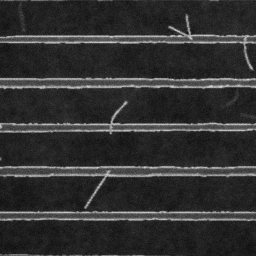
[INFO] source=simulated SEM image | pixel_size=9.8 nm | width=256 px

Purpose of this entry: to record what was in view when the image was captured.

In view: lines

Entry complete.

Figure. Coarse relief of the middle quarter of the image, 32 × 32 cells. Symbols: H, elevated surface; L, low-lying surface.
LLLLLLLLLLLLLLLLLLLLLLLLLLLLLLLL
LLLLLLLLLLLLLLLLLLLLLLLLLLLLLLLL
LLLLLLLLLLLLLLLLLLLLLLLLLLLLLLLL
LLLLLLLLLLLLLLLLLLLLLLLLLLLLLLLL
HHHHHHHHHHHHHHHHHHHHHHHHHHHHHHHH
HHHHHHHHHHHHHHHHHHHHHHHHHHHHHHHH
LLLLLLLLLLLLLLLLLLLLLLLLLLLLLLLL
LLLLLLLLLLLLLLLLLLLLLLLLLLLLLLLL
LLLLLLLLLLLLLLLLLLLLLLLLLLLLLLLL
LLLLLLLLLLLLLLLLLLLLLLLLLLLLLLLL
LLLLLLLLLLLLLLLLLLLLLLLLLLLLLLLL
LLLLLLLLLLLLLLLLLLLLLLLLLLLLLLLL
LLLLLLLLLLLLLLLLLLLLLLLLLLLLLLLL
LLLLLLLLLLLLLLLLLLLLLLLLLLLLLLLL
LLLLLLLLLLLLLLLLLLLLLLLLLLLLLLLL
HHHHHHHHHHHHHHHHHHHHHHHHHHHHHHHH
HHHHHHHHHHHHHHHHHHHHHHHHHHHHHHHH
LLLLLLLLLLLLLLLLLLLLLLLLLLLLLLLL
LLLLLLLLLLLLLLLLLLLLLLLLLLLLLLLL
LLLLLLLLLLLLLLLLLLLLLLLLLLLLLLLL
LLLLLLLLLLLLLLLLLLLLLLLLLLLLLLLL
LLLLLLLLLLLLLLLLLLLLLLLLLLLLLLLL
LLLLLLLLLLLLLLLLLLLLLLLLLLLLLLLL
LLLLLLLLLLLLLLLLLLLLLLLLLLLLLLLL
LLLLLLLLLLLLLLLLLLLLLLLLLLLLLLLL
LLLLLLLLLLLLLLLLLLLLLLLLLLLLLLLL
HHHHHHHHHHHHHHHHHHHHHHHHHHHHHHHH
HHHHHHHHHHHHHHHHHHHHHHHHHHHHHHHH
LLLLLLLLLLLLLLLLLLLLLLLLLLLLLLLL
LLLLLLLLLLLLLLLLLLLLLLLLLLLLLLLL
LLLLLLLLLLLLLLLLLLLLLLLLLLLLLLLL
LLLLLLLLLLLLLLLLLLLLLLLLLLLLLLLL